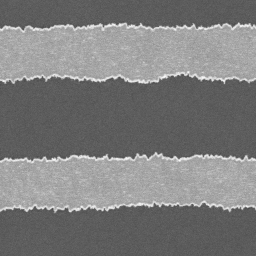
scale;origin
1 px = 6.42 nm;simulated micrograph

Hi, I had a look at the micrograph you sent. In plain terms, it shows one or a few lines or trenches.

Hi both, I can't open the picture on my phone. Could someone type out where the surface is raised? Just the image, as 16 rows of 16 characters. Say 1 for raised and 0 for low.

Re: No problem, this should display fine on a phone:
0000000000000000
0000000000000000
1111111111111111
1111111111111111
1111111111111111
0000000000000000
0000000000000000
0000000000000000
0000000000000000
0000000000000000
1111111111111111
1111111111111111
1111111111111111
0000000000000000
0000000000000000
0000000000000000